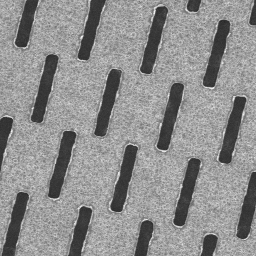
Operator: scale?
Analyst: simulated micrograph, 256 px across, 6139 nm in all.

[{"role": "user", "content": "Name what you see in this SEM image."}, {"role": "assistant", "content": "a regular array of holes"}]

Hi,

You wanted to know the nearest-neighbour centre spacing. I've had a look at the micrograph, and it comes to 1540 nm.